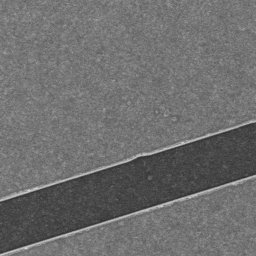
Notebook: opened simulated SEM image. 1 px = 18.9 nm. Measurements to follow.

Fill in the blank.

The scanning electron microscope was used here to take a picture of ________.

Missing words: one or a few lines or trenches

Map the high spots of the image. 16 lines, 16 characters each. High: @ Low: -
@@@@@@@@@@@@@@@@
@@@@@@@@@@@@@@@@
@@@@@@@@@@@@@@@@
@@@@@@@@@@@@@@@@
@@@@@@@@@@@@@@@@
@@@@@@@@@@@@@@@@
@@@@@@@@@@@@@@@@
@@@@@@@@@@@@@@@@
@@@@@@@@@@@@@---
@@@@@@@@@@------
@@@@@@@---------
@@@-----------@@
-----------@@@@@
--------@@@@@@@@
-----@@@@@@@@@@@
-@@@@@@@@@@@@@@@